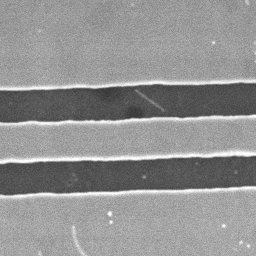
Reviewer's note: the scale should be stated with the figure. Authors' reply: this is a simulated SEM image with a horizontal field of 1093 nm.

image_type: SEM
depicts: lines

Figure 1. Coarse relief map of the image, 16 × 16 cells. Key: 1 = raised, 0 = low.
1111111111111111
1111111111111111
1111111111111111
1111111111111111
1111111111111111
1111100000000000
0000000000000000
0000000011111111
1111111111111111
1111111111111111
0000000000000000
0000000000000000
1111111111111111
1111111111111111
1111111111111111
1111111111111111